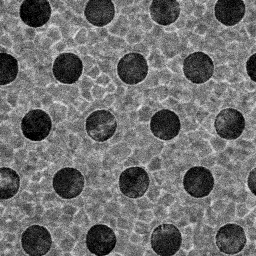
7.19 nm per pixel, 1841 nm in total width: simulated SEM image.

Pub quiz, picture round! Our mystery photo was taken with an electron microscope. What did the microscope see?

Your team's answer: a regular array of holes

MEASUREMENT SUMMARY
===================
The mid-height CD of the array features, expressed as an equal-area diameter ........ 232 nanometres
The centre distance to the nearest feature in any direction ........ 0.464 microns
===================